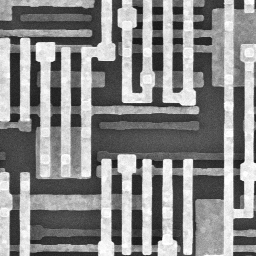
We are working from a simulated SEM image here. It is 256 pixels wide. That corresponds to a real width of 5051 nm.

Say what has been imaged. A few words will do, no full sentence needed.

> wiring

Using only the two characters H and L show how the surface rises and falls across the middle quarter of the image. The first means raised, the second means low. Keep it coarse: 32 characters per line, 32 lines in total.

HHLLLHHLLLLLLLLHHLLLHHLLLHHLLLHH
HHLLHHHLLLLLLLLHHLLLHHLLLHHLLLHH
HHLLHHHLLLLLLLLHHLLHHHHLLHHLLLHH
HHLLHHHLLLLLLLLHHLLHHHHLLHHLLLHH
HHLLHHHLLLLLLLLHHLLHHHHLLHHLLLHH
HHLLHHHLLLLLLLLHHLLHHHLLLHHLLLHH
HHLLHHHLLLLLLLLHHLLLHHLLLHHLLLHH
HHLLHHHLLLLLLLLHHHHHHHLLLHHHHHHH
HHLLHHHLLLLLLLLHHHHHHHLLLHHHHHHH
HHLLHHHLLLLLLLLHHHHHHHLLLHHHHHHH
HHLLHHHLLLLLLLLLLLLLLLLLLLLLLLLL
HHLLHHHLLLLLLLLLLLLLLLLLLLLLLLLL
HHLLHHHLLLLLLLLLLLLLLLLLLLLLLLLL
HHLLHHHLLLLLLLLLLLLLLLLLLLLLLLLL
HHLLLHHLLLLLLLLLLLLLLLLLLLLLLLLL
HHLLLHHLLLLLLLLLLLLLLLLLLLLLLLLL
HHLLHHHLLLLLLLLLLLLLLLLLLLLLLLLL
HHLLHHHLLLLLLLLLLLLLLLLLLLLLLLLL
HHLLLHHLLLLLLLLLLLLLLLLLLLLLLLLL
HHLLLHHLLLLLLLLLLLLLLLLLLLLLLLLL
HHLLHHHLLLLLLLLLLLLLLLLLLLLLLLLL
HHLLHHHLLLLLLLLLLLLLLLLLLLLLLLLL
HHLLHHHLLLLLLLLLLLLLLLLLLLLLLLLL
HHLLHHHLLLLLLLHHHHLLLLLLLLLLLLLL
HHLLHHHLLHHHLLHHHHLLHHLLLHHLLLHH
HHLLHHHLLHHHLLHHHHLLHHLLLHHLLLHH
HHLLLHHLLHHHLLHHHHLLHHLLLHHLLLHH
HHLLLHHLLHHHLLHHHLLLHHLLLHHLLLHH
LLLLLLLLLHHHLLLHHLLLHHLLLHHLLLHH
LLLLLLLLLHHHLLLHHLLLHHLLLHHLLLHH
LLLLLLLLLHHHLLLHHLLLHHLLLHHLLLHH
LLLLLLLLLLHHLLLHHLLLHHLLLHHLLLHH